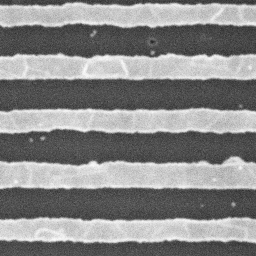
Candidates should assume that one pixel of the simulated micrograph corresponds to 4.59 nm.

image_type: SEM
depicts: lines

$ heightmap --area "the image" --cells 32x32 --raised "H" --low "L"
LLLLLLLLLHLLLLLLLLLLLLLLLLLLLLLL
HHHHHHHHHHHHHHHHHHHHHHHHHHHHHHHH
HHHHHHHHHHHHHHHHHHHHHHHHHHHHHHHH
LLLLLLLLLLLLLLLLLLLLLLLLLLLLLLLL
LLLLLLLLLLLLLLLLLLLLLLLLLLLLLLLL
LLLLLLLLLLLLLLLLLLLLLLLLLLLLLLLL
LLLLLLLLLLLLLLLLLLLLLLLLLLLLLLLL
HHHHHHHHHHHHHHHHHHHHHHHHHHHHHHHH
HHHHHHHHHHHHHHHHHHHHHHHHHHHHHHHH
HHHHHHHHHHHHHHHHHHHHHHHHHHHHHHHH
LLLLLLLLLLLLLLLLLLLLLLLLLLLLLLLL
LLLLLLLLLLLLLLLLLLLLLLLLLLLLLLLL
LLLLLLLLLLLLLLLLLLLLLLLLLLLLLLLL
LLLLLLLLLLLLLLLLLLLLLLLLLLLLLLLL
HHHHHHHHHHHHHHHHHHHHHHHHHHHHHHHH
HHHHHHHHHHHHHHHHHHHHHHHHHHHHHHHH
HHHLLLLLLLLLLHHHHHHLLHHLLLLHLHLL
LLLLLLLLLLLLLLLLLLLLLLLLLLLLLLLL
LLLLLLLLLLLLLLLLLLLLLLLLLLLLLLLL
LLLLLLLLLLLLLLLLLLLLLLLLLLLLLLLL
HHHHHHLLLLLLLHHHHHHLLHHHHLLLLHHH
HHHHHHHHHHHHHHHHHHHHHHHHHHHHHHHH
HHHHHHHHHHHHHHHHHHHHHHHHHHHHHHHH
LLLLLLLLLLLLLLLLLLLLLLLLLLHHHLLH
LLLLLLLLLLLLLLLLLLLLLLLLLLLLLLLL
LLLLLLLLLLLLLLLLLLLLLLLLLLLLLLLL
LLLLLLLLLLLLLLLLLLLLLLLLLLLLLLLL
LLHHHHHHHHLLLLLLLLLLLLHLLLLLHHHH
HHHHHHHHHHHHHHHHHHHHHHHHHHHHHHHH
HHHHHHHHHHHHHHHHHHHHHHHHHHHHHHHH
LLLLLLLLLLLLLLLLLLLLLLLLLLLLLLLL
LLLLLLLLLLLLLLLLLLLLLLLLLLLLLLLL